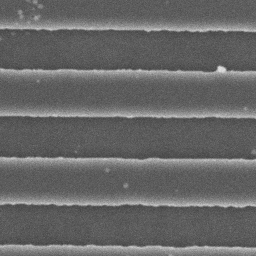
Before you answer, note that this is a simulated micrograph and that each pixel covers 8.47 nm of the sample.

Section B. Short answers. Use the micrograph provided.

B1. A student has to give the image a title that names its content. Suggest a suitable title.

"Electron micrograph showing lines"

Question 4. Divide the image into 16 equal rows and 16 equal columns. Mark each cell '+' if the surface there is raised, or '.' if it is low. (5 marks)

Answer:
++++++++++++++++
++++++++++++++++
................
................
++++++++++++++++
++++++++++++++++
++++++++++++++++
................
................
................
++++++++++++++++
++++++++++++++++
++++++++++++++++
................
................
++++++++++++++++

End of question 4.